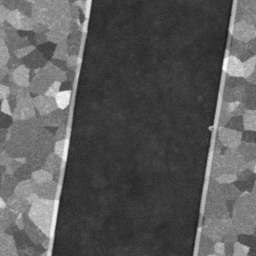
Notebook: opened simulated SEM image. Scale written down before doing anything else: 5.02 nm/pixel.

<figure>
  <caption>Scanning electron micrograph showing one or a few lines or trenches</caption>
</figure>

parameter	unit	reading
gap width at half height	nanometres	724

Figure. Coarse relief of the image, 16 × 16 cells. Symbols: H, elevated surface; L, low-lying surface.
HHHHHHLLLLLLLLLH
HHHHHLLLLLLLLLHH
HHHHHLLLLLLLLLHH
HHHHHLLLLLLLLLHH
HHHHHLLLLLLLLLHH
HHHHHLLLLLLLLLHH
HHHHHLLLLLLLLLHH
HHHHLLLLLLLLLLHH
HHHHLLLLLLLLLHHH
HHHHLLLLLLLLLHHH
HHHHLLLLLLLLLHHH
HHHHLLLLLLLLLHHH
HHHHLLLLLLLLLHHH
HHHLLLLLLLLLLHHH
HHHLLLLLLLLLHHHH
HHHLLLLLLLLLHHHH